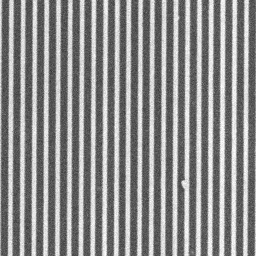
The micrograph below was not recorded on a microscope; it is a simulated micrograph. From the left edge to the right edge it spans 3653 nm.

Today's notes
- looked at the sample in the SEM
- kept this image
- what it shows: parallel lines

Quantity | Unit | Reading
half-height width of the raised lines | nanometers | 51.7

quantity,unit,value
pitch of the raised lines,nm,168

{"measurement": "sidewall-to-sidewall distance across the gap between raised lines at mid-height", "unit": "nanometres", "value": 116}